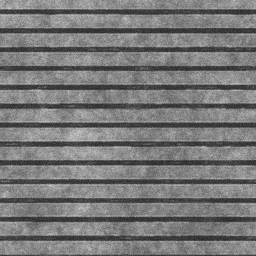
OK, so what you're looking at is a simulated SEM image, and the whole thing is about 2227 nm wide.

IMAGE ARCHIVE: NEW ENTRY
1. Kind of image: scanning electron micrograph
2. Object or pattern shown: parallel lines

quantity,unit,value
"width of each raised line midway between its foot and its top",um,0.113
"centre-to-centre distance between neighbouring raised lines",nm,164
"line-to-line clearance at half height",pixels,5.75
